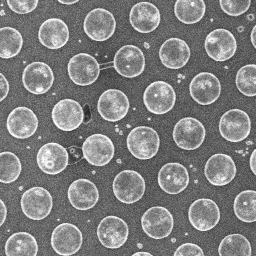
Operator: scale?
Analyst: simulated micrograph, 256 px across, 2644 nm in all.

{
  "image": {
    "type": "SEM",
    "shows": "a regular array of raised bodies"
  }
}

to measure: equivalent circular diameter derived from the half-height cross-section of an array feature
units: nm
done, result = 324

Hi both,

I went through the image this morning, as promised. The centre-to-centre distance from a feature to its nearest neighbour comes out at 477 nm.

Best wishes